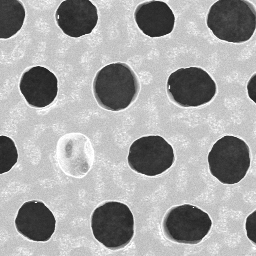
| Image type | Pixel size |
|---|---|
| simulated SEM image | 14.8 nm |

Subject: a regular array of holes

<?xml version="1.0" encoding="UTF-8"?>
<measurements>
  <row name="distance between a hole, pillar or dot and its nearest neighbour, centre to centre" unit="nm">1120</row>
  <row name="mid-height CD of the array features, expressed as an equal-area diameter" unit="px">42.7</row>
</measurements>